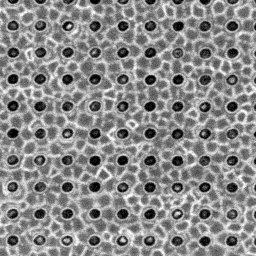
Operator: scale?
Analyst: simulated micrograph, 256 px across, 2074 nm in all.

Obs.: a regular array of holes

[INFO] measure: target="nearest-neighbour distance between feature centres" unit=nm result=216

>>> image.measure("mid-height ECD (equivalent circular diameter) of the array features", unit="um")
0.095